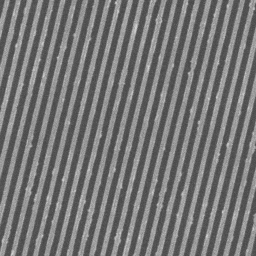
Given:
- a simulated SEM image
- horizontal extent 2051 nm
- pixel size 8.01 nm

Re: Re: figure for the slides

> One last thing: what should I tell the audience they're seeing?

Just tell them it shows parallel lines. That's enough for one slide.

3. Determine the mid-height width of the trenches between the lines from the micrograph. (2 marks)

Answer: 0.0506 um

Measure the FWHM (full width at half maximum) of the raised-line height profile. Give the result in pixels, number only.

4.49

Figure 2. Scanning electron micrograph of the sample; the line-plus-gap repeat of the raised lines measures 87.2 nanometers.